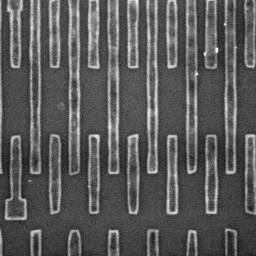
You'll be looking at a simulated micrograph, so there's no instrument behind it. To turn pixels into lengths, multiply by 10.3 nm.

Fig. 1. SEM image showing wiring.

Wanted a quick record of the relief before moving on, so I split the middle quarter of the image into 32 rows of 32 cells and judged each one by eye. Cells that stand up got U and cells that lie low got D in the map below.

DDUUDDUUUDDUUDDDUUDDDUUDDDUUDDDU
DDUUDDDDDDDUUDDDDDDDDUUDDDDDDDDU
DDUUDDDDDDDUUDDDDDDDDUUDDDDDDDDU
DDUUDDDDDDDUUDDDDDDDDUUDDDDDDDDU
DDUUDDDDDDDUUDDDDDDDDUUDDDDDDDDU
DDUUDDDDDDDUUDDDDDDDDUUDDDDDDDDU
DDUUDDDDDDDUUDDDDDDDDUUDDDDDDDDU
DDUUDDDDDDDUUDDDDDDDDUUDDDDDDDDU
DDUUDDDDDDDUUDDDDDDDDUUDDDDDDDDU
DDUUDDDDDDDUUDDDDDDDDUUDDDDDDDDU
DDUUDDDDDDDUUDDDDDDDDUUDDDDDDDDU
DDUUDDDDDDDUUDDDDDDDDUUDDDDDDDDU
DDUUDDDDDDDUUDDDDDDDDUUDDDDDDDDU
DDUUDDDDDDDUUDDDDDDDDUUDDDDDDDDU
DDUUDDDDDDDUUDDDDDDDDUUDDDDDDDDU
DDUUDDDDDDDUUDDDDDDDDUUDDDDDDDDU
DDUUDDDDDDDUUDDDDDDDDUUDDDDDDDDU
DDUUDDDDDDDUUDDDDDDDDUUDDDDDDDDU
DDUUDDUUUDDUUDDDUUDDDUUDDDUUDDDU
DUUUDDDUUDDUUDDDUUDDDUUDDDUUDDDU
DUUUDDDUUDDUUDDDUUDDDUUDDDUUDDDU
DUUUDDDUUDDUUDDDUUDDDUUDDDUUDDDU
DDUUDDDUUDDUUDDDUUDDDUUDDDUUDDDU
DDUUDDUUUDDUUUDDUUDDDUUDDDUUDDDU
DDUUDDUUUDDUUUDDUUUDDUUDDDUUDDDU
DDUUDDUUUDDUUUDDUUUDDUUDDDUUDDDU
DDUUDDUUUDDUUUDDUUUDDUUDDDUUDDDU
DDDDDDUUUDDDDDDDUUUDDDDDDDUUDDDD
DDDDDDUUUDDDDDDDUUUDDDDDDDUUDDDD
DDDDDDUUUDDDDDDDUUUDDDDDDDUUDDDD
DDDDDDUUUDDDDDDDUUUDDDDDDDUUDDDD
DDDDDDUUUDDDDDDDUUUDDDDDDDUUDDDD